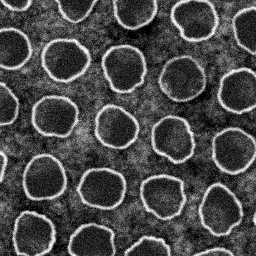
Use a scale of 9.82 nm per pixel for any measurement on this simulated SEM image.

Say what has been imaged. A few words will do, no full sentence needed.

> a regular array of raised bodies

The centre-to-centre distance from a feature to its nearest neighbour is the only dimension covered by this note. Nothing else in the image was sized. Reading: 574 nm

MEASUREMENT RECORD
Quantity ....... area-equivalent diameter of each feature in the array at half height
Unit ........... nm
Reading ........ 426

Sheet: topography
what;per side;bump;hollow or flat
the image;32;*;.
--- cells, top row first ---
.***...*****..*****...****......
........***...*****...*****...**
.........*.....****...*****..***
................*.....*****..***
***....................***...***
****..****....................**
****.******...***..............*
***..******..*****..............
.*....*****..*****..............
......****...*****..........****
..............***...........****
*..........................*****
**...****..................*****
**..******...**.............****
**..******..****................
*...*****...*****...***.........
.....****...*****..*****....**..
.............****..*****...*****
..............*....*****...*****
*....*...............***...*****
*...***....................****.
...*****...***..............**..
...*****..*****...****..........
...*****..******..*****...**....
....***...*****...*****...***...
...........****...*****..*****..
...................***...*****..
..****...................*****..
..*****...***.............***...
..*****..*****..................
..*****..*****...****...........
..****...*****..*****.....***...